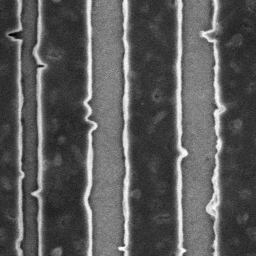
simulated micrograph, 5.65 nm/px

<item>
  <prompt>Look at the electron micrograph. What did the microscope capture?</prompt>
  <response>one or a few lines or trenches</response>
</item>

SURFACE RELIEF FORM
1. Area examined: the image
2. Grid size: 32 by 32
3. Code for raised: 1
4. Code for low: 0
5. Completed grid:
11100111111000001111110000011111
11100111111000001111111000011111
11100111111000001111111000011111
11100111111000001111111000011111
10000111111000001111111000111111
11100111111000001111111000011111
11101111111000001111111000011111
11000111111000001111110000011111
11100111111000001111110000011111
11100111111000001111110000011111
11100111111000001111110000011111
11100111111000001111110000011111
11100111111000001111110000011111
11100111111000001111110000011111
11100111111000001111110000011111
11100111111100001111110000011111
11100111111100001111111000011111
11000111111000001111111000011111
11100111111000001111111000011111
11100111111000001111111000011111
11100111111000001111110000011111
11100111111000001111110000011111
11100111111000001111111000011111
11100111111000001111110000011111
11100111111000001111110000011111
11100111111000001111111000011111
11100111111000001111111000011111
11100111111000001111111000011111
11100111111000001111111000011111
11100111111000001111111000011111
11000111111000001111111000011111
11100111111000001111111000011111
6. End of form